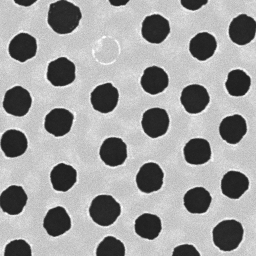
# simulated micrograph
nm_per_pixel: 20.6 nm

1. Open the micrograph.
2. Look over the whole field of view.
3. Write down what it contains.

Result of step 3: a regular array of holes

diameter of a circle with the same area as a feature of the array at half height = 0.593 µm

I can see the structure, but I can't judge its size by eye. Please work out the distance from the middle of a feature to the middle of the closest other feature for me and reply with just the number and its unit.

936 nm